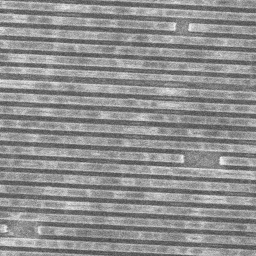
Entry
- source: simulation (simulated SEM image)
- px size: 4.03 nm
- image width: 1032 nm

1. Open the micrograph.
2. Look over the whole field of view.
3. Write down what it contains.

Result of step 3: parallel lines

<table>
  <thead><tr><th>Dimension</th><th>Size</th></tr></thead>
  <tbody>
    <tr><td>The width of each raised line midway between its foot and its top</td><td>30.7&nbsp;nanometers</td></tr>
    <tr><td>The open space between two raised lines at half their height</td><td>22.6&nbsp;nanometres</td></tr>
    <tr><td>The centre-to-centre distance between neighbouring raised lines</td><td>53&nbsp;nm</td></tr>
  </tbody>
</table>